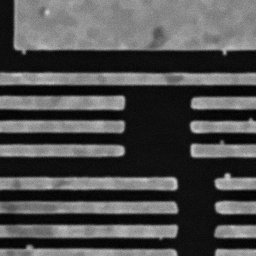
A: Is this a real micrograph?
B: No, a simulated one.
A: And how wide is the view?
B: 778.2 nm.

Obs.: wiring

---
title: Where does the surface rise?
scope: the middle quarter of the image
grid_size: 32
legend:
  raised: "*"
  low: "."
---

................................
................................
................................
********************************
********************************
................................
................................
................................
***************.................
***************.................
***************.................
................................
................................
................................
***************.................
***************.................
***************.................
................................
................................
................................
**************..................
***************.................
***************.................
................................
................................
................................
................................
................................
.*****....****........******....
****************************....
****************************....
................................